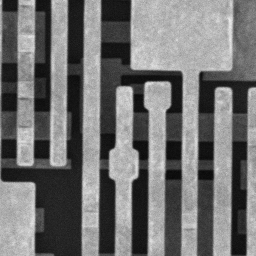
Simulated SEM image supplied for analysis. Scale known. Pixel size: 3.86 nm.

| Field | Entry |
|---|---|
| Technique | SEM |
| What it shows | wiring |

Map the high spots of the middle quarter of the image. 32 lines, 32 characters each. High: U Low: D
UDDDDUUUUDDDDDDDDUUUUUUUUUUUUUUU
UDDDDUUUUDDDDDDDDDDDDDDDUUUUUUUU
UDDDDUUUUDDDDDDDDDDDDDDDDDDDDDUU
UDDDDUUUUDDDDDDDDDDDDDDDDDDDDDUU
UDDDDUUUUDDDDDDDDDDDDUUUUUDDDDUU
UDDDDUUUUDDDDDDDDDDDUUUUUUUDDDUU
UDDDDUUUUDDDDUUUUDDDUUUUUUUDDDUU
UDDDDUUUUDDDDUUUUDDDUUUUUUUDDDUU
DDDDDUUUUDDDDUUUUDDDUUUUUUUDDDUU
DDDDDUUUUDDDDUUUUDDDUUUUUUUDDDUU
DDDDDUUUUDDDDUUUUDDDUUUUUUUDDDUU
DDDDDUUUUDDDDUUUUDDDDUUUUUDDDDUU
DDDDDUUUUDDDDUUUUDDDDUUUUDDDDDUU
DDDDDUUUUDDDDUUUUDDDDUUUUDDDDDUU
DDDDDUUUUDDDDUUUUDDDDUUUUDDDDDUU
DDDDDUUUUDDDDUUUUDDDDUUUUDDDDDUU
DDDDDUUUUDDDDUUUUDDDDUUUUDDDDDUU
DDDDDUUUUDDDDUUUUDDDDUUUUDDDDDUU
DDDDDUUUUDDDDUUUUDDDDUUUUDDDDDUU
DDDDDUUUUDDDDUUUUDDDDUUUUDDDDDUU
DDDDDUUUUDDDDUUUUDDDDUUUUDDDDUUU
DDDDDUUUUDDDUUUUUUDDDUUUUDDDDUUU
DDDDDUUUUDDDUUUUUUDDDUUUUDDDDUUU
DDDDDUUUUDDDUUUUUUDDDUUUUDDDDUUU
DDDDDUUUUDDDUUUUUUDDDUUUUDDDDUUU
DDDDDUUUUDDDUUUUUUDDDUUUUDDDDUUU
DDDDDUUUUDDDUUUUUUDDDUUUUDDDDDUU
DDDDDUUUUDDDUUUUUUDDDUUUUDDDDDUU
DDDDDUUUUDDDUUUUUUDDDUUUUDDDDDUU
DDDDDUUUUDDDDUUUUDDDDUUUUDDDDDUU
DDDDDUUUUDDDDUUUUDDDDUUUUDDDDUUU
DDDDDUUUUDDDDUUUUDDDDUUUUDDDDUUU